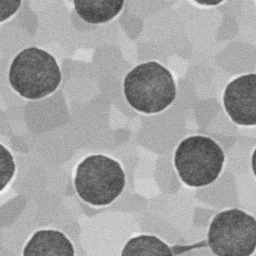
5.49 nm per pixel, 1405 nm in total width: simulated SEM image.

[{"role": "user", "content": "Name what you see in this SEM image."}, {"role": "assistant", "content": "holes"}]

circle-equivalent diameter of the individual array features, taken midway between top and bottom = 0.283 micrometres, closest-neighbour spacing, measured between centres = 0.519 micrometres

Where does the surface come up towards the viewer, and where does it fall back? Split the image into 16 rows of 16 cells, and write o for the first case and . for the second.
.oooo...oooooooo
oooooooooooooooo
oooooooooooooooo
o..ooooooooooooo
o...oooo...ooooo
o...oooo...ooo..
oooooooo...ooo..
ooooooooooooooo.
oooooooooooo.ooo
.oooooooooo...oo
.oooo...ooo...oo
.oooo...oooo.ooo
ooooo..ooooooooo
oooooooooooooo..
oo..ooooooooo...
oo...ooo...oo...